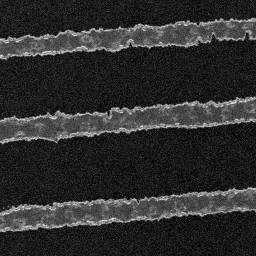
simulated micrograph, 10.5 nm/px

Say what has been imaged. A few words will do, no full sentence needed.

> one or a few lines or trenches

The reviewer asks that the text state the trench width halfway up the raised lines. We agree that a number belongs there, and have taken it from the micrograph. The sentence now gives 681 nanometres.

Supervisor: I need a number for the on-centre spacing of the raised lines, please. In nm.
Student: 902